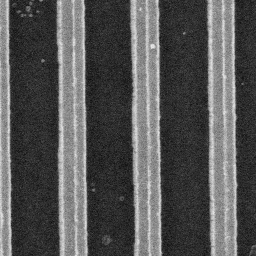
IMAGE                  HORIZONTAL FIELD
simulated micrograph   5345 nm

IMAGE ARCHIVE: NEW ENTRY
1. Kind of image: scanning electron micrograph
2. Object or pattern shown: lines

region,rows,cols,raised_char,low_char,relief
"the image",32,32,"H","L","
HLLLLLLHHHLLLLLLLHHHLLLLLLHHHLLL
HLLLLLLLHHLLLLLLLHHHLLLLLLHHHLLL
HLLLLLLLHHLLLLLLLHHHLLLLLLHHHLLL
HLLLLLLLHHLLLLLLLHHHLLLLLLHHHLLL
HLLLLLLLHHLLLLLLLHHHLLLLLLHHHLLL
HLLLLLLLHHLLLLLLLHHHLLLLLLHHHLLL
HLLLLLLLHHHLLLLLLHHHLLLLLLHHHLLL
HLLLLLLLHHHLLLLLLHHHLLLLLLHHHLLL
HLLLLLLLHHHLLLLLLHHHLLLLLLHHHLLL
HLLLLLLLHHHLLLLLLHHHLLLLLLHHHLLL
HLLLLLLLHHHLLLLLLHHHLLLLLLHHHLLL
HLLLLLLLHHHLLLLLLHHHLLLLLLHHHLLL
HLLLLLLLHHHLLLLLLHHHLLLLLLHHHLLL
HLLLLLLLHHHLLLLLLHHHLLLLLLHHHLLL
HLLLLLLLHHHLLLLLLHHHLLLLLLHHHLLL
HLLLLLLLHHHLLLLLLHHHLLLLLLHHHLLL
HLLLLLLLHHHLLLLLLHHHLLLLLLHHHLLL
HLLLLLLLHHHLLLLLLHHHLLLLLLHHHLLL
HLLLLLLLHHHLLLLLLHHHLLLLLLHHHLLL
HLLLLLLLHHHLLLLLLHHHLLLLLLLHHLLL
HLLLLLLLHHHLLLLLLHHHLLLLLLLHHLLL
HLLLLLLLHHHLLLLLLHHHLLLLLLLHHLLL
HLLLLLLLHHHLLLLLLHHHLLLLLLLHHLLL
HLLLLLLLHHHLLLLLLHHHLLLLLLLHHLLL
HLLLLLLLHHHLLLLLLHHHLLLLLLLHHLLL
HLLLLLLLHHHLLLLLLHHHLLLLLLLHHLLL
HLLLLLLLHHHLLLLLLHHHLLLLLLLHHLLL
HLLLLLLLHHHLLLLLLHHHLLLLLLLHHLLL
HLLLLLLLHHHLLLLLLHHHLLLLLLLHHLLL
HLLLLLLLHHHLLLLLLHHHLLLLLLLHHLLL
HLLLLLLLHHHLLLLLLHHHLLLLLLLHHLLL
HLLLLLLLHHHLLLLLLHHHLLLLLLLHHLLL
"